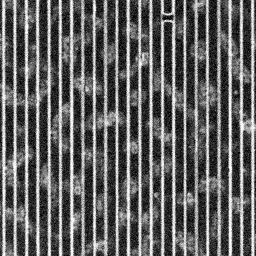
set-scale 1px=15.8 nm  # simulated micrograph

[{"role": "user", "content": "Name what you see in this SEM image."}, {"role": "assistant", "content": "parallel lines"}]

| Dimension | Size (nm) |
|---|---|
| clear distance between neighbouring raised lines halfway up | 148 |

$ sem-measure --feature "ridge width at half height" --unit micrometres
0.0276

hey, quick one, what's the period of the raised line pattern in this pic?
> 179 nm